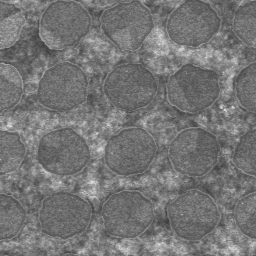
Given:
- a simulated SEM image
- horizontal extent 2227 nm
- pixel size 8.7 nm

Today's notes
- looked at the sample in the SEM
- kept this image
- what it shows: a regular array of raised bodies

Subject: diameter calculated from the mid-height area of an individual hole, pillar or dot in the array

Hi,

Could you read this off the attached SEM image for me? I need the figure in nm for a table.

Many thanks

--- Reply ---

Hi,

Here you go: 441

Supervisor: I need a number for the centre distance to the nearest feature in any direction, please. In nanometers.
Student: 550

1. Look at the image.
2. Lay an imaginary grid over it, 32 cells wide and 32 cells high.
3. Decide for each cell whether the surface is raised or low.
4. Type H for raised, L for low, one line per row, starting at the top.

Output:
HHLLLLHHHHLLLLLHHHLLLLLHHHLLLLLH
HHHLLHHHHHHLLHHHHHHLLLHHHHHLLHHH
HHHLLHHHHHHLLHHHHHHLLHHHHHHHLHHH
HHHLLHHHHHHLLHHHHHHLLHHHHHHHLHHH
HHLLLHHHHHHLLHHHHHLLLHHHHHHLLLHH
HHLLLLHHHLLLLLHHHHLLLLHHHLLLLLLH
LLLLLLLLLLLLLLLLLLLLLLLLLLLLLLLL
LLLLLLLLLLLLLLLLLLLLLLLLLLHLLLLL
HHLLLLHHHHLLLLHHHHLLLLHHHLLLLLHH
HHHLLHHHHHHLLHHHHHHLLHHHHHHLLLHH
HHHLLHHHHHHLLHHHHHHHLHHHHHHLLHHH
HHHLLHHHHHHLLHHHHHHHLHHHHHHLLLHH
HHLLLHHHHHHLLLHHHHHLLHHHHHHLLLHH
HLLLLLHHHLLLLLLHHHLLLLHHHHLLLLLH
LLLLLLLLLLLLLLLLLLLLLLLLLLLLLLLL
LLLLLLLLLLLLLLLLLLLLLLLLLLLLLLLL
HHLLLLHHHHLLLLLHHHHLLLLHHHLLLLLH
HHHLLHHHHHHLLLHHHHHLLLHHHHHLLLHH
HHHLLHHHHHHLLHHHHHHHLHHHHHHHLHHH
HHHLLHHHHHHLLHHHHHHLLHHHHHHLLHHH
HHHLLHHHHHHLLHHHHHHLLLHHHHHLLHHH
HHLLLLHHHHLLLLHHHHLLLLHHHHLLLLHH
LLLLLLLLLLLLLLLLLLLLLLLLLLLLLLLL
LLLLLLLLLLLLLLLLLLLLLLLLLLLLLLLL
HLLLLLHHHHLLLLHHHHLLLLLHHHLLLLLH
HHHLLHHHHHHLLHHHHHHLLHHHHHHLLLHH
HHHLLHHHHHHLLHHHHHHLLHHHHHHLLHHH
HHHLLHHHHHHLLHHHHHHLLHHHHHHLLHHH
HHHLLHHHHHHLLHHHHHLLLHHHHHHLLLHH
HHLLLLHHHLLLLLHHHLLLLLHHHHLLLLLH
LLLLLLLLLLLLLLLLLLLLLLLLLLLLLLLL
LLLLLLLLLLLLLLLLLLLLLLLLLLLLLLLL